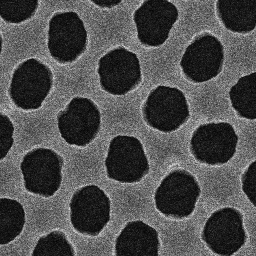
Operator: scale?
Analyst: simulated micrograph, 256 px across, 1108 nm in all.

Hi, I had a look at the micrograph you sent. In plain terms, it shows a regular array of holes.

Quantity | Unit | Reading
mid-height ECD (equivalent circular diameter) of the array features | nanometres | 196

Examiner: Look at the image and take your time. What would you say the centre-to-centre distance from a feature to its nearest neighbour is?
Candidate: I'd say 261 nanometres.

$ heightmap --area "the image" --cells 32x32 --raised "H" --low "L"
LLLLLHHHHHHHLLLHHHLLLLHHHHHLLLLL
LLLLHHHHLHHHHHHHHLLLLLHHHHHLLLLL
HLLHHHLLLLHHHHHHHLLLLLHHHHHHLLLL
HHHHHHLLLLLHHHHHHLLLLHHHHHHHLLLL
HHHHHHLLLLLHHHHHHLLLLHHHHLLHHHHH
HHHHHHLLLLLHHHHHHHLLHHHHLLLLHHHH
HHHHHHLLLLHHHHLLHHHHHHHLLLLLHHHH
HHHLLHHLLHHHHLLLLHHHHHHLLLLLHHHH
HHLLLLHHHHHHLLLLLLHHHHHLLLLLHHHH
HHLLLLHHHHHHLLLLLLHHHHHLLLLHHHHL
HLLLLLHHHHHHHLLLLHHHHHHHHHHHHLLL
HLLLLLHHHHHHHLLLHHHLLLLHHHHHHLLL
HHLLLHHHHLLHHHHHHHLLLLLHHHHHHLLL
HHHLLHHHLLLLHHHHHHLLLLLHHHHHHLLL
LHHHHHHLLLLLLHHHHHLLLLLLHHHHHHLL
LLHHHHHLLLLLLHHHHHHLLLLHHHLLLHHH
LLHHHHHLLLLLHHHHHHHHHHHHLLLLLHHH
LLHHHHHHLLLHHHLLLHHHHHHHLLLLLLHH
LHHHHHHHHHHHHHLLLLHHHHHHLLLLLLHH
LHHLLLLHHHHHHLLLLLHHHHHHLLLLLHHH
HHHLLLLLHHHHHLLLLLLHHHHHHHLHHHHL
HHHLLLLLHHHHHLLLLLHHHHLHHHHHHHHL
HHHLLLLLHHHHHHLLLHHHLLLLHHHHHHLL
HHHLLLLHHHLLHHHHHHHHLLLLLHHHHHLL
HHHHHLHHHLLLLHHHHHHLLLLLLHHHHHHL
LLLHHHHHHLLLLLHHHHHLLLLLHHHHHHHH
LLLHHHHHHLLLLLHHHHHHLLLLHHHLLLHH
LLLHHHHHHLLLLLHHHHHHHHHHHHLLLLHH
LLLHHHHHHLLLLHHHLLLHHHHHHLLLLLHH
LLHHHHLLHHHHHHHLLLLLHHHHHLLLLLLH
LHHHHLLLLHHHHHLLLLLLHHHHHHLLLLHH
HHHHLLLLLHHHHHLLLLLLHHHHHHHLLHHH